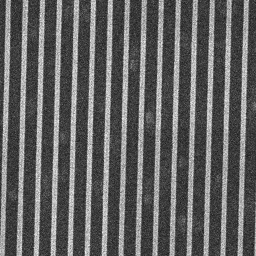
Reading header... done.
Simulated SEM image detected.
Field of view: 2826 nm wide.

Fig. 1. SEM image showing parallel lines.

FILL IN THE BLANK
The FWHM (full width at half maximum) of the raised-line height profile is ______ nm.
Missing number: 48.3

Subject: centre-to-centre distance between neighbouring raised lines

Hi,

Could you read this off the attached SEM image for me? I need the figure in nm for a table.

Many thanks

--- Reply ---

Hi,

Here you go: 188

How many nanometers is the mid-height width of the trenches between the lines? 135